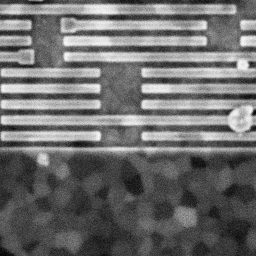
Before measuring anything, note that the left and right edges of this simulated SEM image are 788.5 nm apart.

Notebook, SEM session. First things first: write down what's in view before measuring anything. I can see wiring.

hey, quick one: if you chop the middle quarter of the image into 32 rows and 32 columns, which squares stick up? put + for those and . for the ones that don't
................................
+++++++++...........++++++++++++
+++++++++...........++++++++++++
................................
................................
+++++++++...........++++++++++++
+++++++++...........++++++++++++
................................
................................
+++++++++...........++++++++++++
+++++++++...........++++++++++++
................................
................................
++++++++++++++++++++++++++++++++
++++++++++++++++++++++++++++++++
................................
................................
+++++++++...........++++++++++++
+++++++++...........++++++++++++
................................
................................
++++++++++++++++++++++++++++++++
++++++++++++++++++++++++++++++++
++++++++++++++++++++++++++++++++
++++++++++++++++++++++++++++++++
++++++++++++++++++++++++++++++++
++++++++++++++++++++++++++++++++
++++++++++++++++++++++++++++++++
++++++++++++++++++++++++++++++++
++++++++++++++++++++++++++++++++
++++++++++++++++++++++++++++++++
++++++++++++++++++++++++++++++++